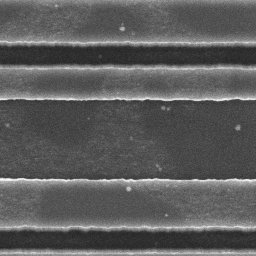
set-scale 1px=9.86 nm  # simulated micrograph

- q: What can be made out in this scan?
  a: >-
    lines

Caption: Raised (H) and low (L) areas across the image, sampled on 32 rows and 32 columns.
HHHHHHHHHHHHHHHHHHHHHHHHHHHHHHHH
HHHHHHHHHHHHHHHHHHHHHHHHHHHHHHHH
HHHHHHHHHHHHHHHHHHHHHHHHHHHHHHHH
HHHHHHHHHHHHHHHHHHHHHHHHHHHHHHHH
HHHHHHHHHHHHHHHHHHHHHHHHHHHHHHHH
LLLLLLLLLLLLLLLLLLLLLLLLLLLLLLLL
LLLLLLLLLLLLLLLLLLLLLLLLLLLLLLLL
LLLLLLLLLLLLLLLLLLLLLLLLLLLLLLLL
HLHHLLLHHHLHHHHLHHLHHLLLLLHHHHLL
HHHHHHHHHHHHHHHHHHHHHHHHHHHHHHHH
HHHHHHHHHHHHHHHHHHHHHHHHHHHHHHHH
HHHHHHHHHHHHHHHHHHHHHHHHHHHHHHHH
LLLLLLLLLLLLLLLLLLLLLLLLHLLHLLLL
LLLLLLLLLLLLLLLLLLLLLLLLLLLLLLLL
LLLLLLLLLLLLLLLLLLLLLLLLLLLLLLLL
LLLLLLLLLLLLLLLLLLLLLLLLLLLLLLLL
LLLLLLLLLLLLLLLLLLLLLLLLLLLLLLLL
LLLLLLLLLLLLLLLLLLLLLLLLLLLLLLLL
LLLLLLLLLLLLLLLLLLLLLLLLLLLLLLLL
LLLLLLLLLLLLLLLLLLLLLLLLLLLLLLLL
LLLLLLLLLLLLLLLLLLLLLLLLLLLLLLLL
LLLLLLLLLLLLLLLLLLLLLLLLLLLLLLLL
HHHHHLHHLHHLLLHHHLHHHLLLHLHLHHLL
HHHHHHHHHHHHHHHHHHHHHHHHHHHHHHHH
HHHHHHHHHHHHHHHHHHHHHHHHHHHHHHHH
HHHHHHHHHHHHHHHHHHHHHHHHHHHHHHHH
HHHHHHHHHHHHHHHHHHHHHHHHHHHHHHHH
HHHHHHHHHHHHHHHHHHHHHHHHHHHHHHHH
LLLLLLLLLLLLLLLLLLLLLLLLLLLLLLLL
LLLLLLLLLLLLLLLLLLLLLLLLLLLLLLLL
LLLLLLLLLLLLLLLLLLLLLLLLLLLLLLLL
LLLLLLLLLLLLLLLLLLLLLLLLLLLLLLLL